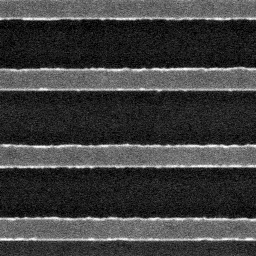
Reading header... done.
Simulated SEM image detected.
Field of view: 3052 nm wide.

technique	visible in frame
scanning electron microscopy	lines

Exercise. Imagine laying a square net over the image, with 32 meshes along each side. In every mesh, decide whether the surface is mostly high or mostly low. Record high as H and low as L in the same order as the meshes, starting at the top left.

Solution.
HHHHHHHHHHHHHHHHHHHHHHHHHHHHHHHH
HHHHHHHHHHHHHHHHHHHHHHHHHHHHHHHH
LLLLLLLLLLLLLLLLLLLLLLLLLLLLLLLL
LLLLLLLLLLLLLLLLLLLLLLLLLLLLLLLL
LLLLLLLLLLLLLLLLLLLLLLLLLLLLLLLL
LLLLLLLLLLLLLLLLLLLLLLLLLLLLLLLL
LLLLLLLLLLLLLLLLLLLLLLLLLLLLLLLL
LLLLLLLLLLLLLLLLLLLLLLLLLLLLLLLL
LLLLLLLLLLLLLLLLLLLLLLLLLLLLLHHL
HHHHHHHHHHHHHHHHHHHHHHHHHHHHHHHH
HHHHHHHHHHHHHHHHHHHHHHHHHHHHHHHH
LLLLLLLLLLLLLLLLLLLLLLLLLLLLLLLL
LLLLLLLLLLLLLLLLLLLLLLLLLLLLLLLL
LLLLLLLLLLLLLLLLLLLLLLLLLLLLLLLL
LLLLLLLLLLLLLLLLLLLLLLLLLLLLLLLL
LLLLLLLLLLLLLLLLLLLLLLLLLLLLLLLL
LLLLLLLLLLLLLLLLLLLLLLLLLLLLLLLL
LLLLLLLLLLLLLLLLLLLLLLLLLLLLLLLL
HHHHHHHHHHHHHHHHHHHHHHHHHHHHHHHH
HHHHHHHHHHHHHHHHHHHHHHHHHHHHHHHH
HHHHHHHHHHHHHHHHHHHHHHHHHHHHHHHH
LLLLLLLLLLLLLLLLLLLLLLLLLLLLLLLL
LLLLLLLLLLLLLLLLLLLLLLLLLLLLLLLL
LLLLLLLLLLLLLLLLLLLLLLLLLLLLLLLL
LLLLLLLLLLLLLLLLLLLLLLLLLLLLLLLL
LLLLLLLLLLLLLLLLLLLLLLLLLLLLLLLL
LLLLLLLLLLLLLLLLLLLLLLLLLLLLLLLL
HHHHHHHHHHHHHHHHHHHHHHHHHHHHHHHH
HHHHHHHHHHHHHHHHHHHHHHHHHHHHHHHH
HHHHHHHHHHHHHHHHHHHHHHHHHHHHHHHH
LLLLLLLLLLLLLLLLLLLLLLLLLLLLLLLL
LLLLLLLLLLLLLLLLLLLLLLLLLLLLLLLL